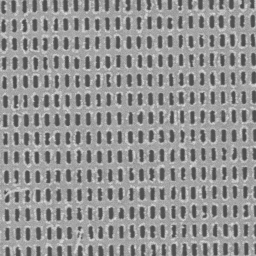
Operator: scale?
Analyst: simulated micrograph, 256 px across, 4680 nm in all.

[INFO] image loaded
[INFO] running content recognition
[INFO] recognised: a regular array of holes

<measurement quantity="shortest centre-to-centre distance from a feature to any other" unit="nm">186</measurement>